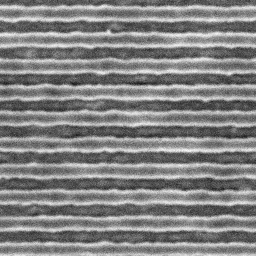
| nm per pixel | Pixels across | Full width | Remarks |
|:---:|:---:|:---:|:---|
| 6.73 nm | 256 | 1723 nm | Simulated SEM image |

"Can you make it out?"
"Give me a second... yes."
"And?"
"parallel lines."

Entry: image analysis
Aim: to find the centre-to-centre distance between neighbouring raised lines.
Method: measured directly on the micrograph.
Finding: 176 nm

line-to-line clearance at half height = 13 px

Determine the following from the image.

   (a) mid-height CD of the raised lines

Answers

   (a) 86.7 nm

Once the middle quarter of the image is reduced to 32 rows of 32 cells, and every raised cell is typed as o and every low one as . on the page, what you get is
oooooooooooooooooooooooooooooooo
oooooooooooooooooooooooooooooooo
................................
................................
................................
o.......o.....oo...........oo...
oooooooooooooooooooooooooooooooo
oooooooooooooooooooooooooooooooo
oo..ooooo...oooooooooooooooooooo
................................
................................
................................
oooooooooooooooooooooooooooooooo
oooooooooooooooooooooooooooooooo
oooooooooooooooooooooooooooooooo
................oo..............
................................
................................
...........o....................
oooooooooooooooooooooooooooooooo
oooooooooooooooooooooooooooooooo
.oo.oooooo.oo.ooooooo.oo.ooooooo
................................
................................
................................
oooooooooooooooooooooooooooooooo
oooooooooooooooooooooooooooooooo
oooooooooooooooooooooooooooooooo
................................
................................
................................
................................